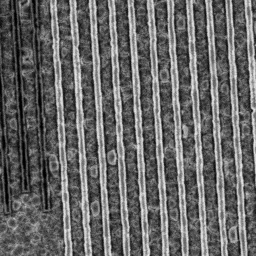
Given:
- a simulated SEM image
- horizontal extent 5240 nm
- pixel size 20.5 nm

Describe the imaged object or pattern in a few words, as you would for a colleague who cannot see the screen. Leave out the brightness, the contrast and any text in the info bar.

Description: parallel lines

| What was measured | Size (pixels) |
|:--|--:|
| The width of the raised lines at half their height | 5.36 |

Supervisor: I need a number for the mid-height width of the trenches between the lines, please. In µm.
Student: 0.294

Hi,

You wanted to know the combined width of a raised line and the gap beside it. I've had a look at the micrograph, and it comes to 398 nm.